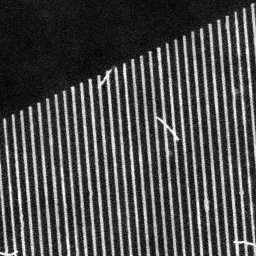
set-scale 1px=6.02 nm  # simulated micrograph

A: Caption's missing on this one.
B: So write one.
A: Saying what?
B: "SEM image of parallel lines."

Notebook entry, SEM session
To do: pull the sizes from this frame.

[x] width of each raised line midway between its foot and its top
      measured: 15.7 nanometers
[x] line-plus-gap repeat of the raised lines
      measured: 53 nm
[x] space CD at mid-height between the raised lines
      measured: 37.5 nanometres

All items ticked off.